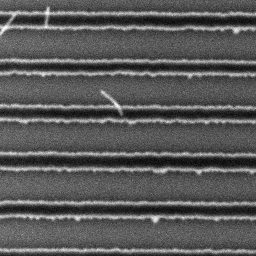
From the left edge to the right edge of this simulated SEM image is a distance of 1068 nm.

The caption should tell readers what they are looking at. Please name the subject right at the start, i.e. lines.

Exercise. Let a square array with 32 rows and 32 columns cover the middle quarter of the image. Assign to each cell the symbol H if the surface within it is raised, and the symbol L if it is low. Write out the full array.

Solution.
HHHHHHHHHHHHHHHHHHHHHHHHHHHHHHHH
HHHHHHHHHHHHHHHHHHHHHHHHHHHHHHHH
HHHHLHHHHHLHHLLLLHHHLHHHHHHHHHHH
LLLLLLLLLLLLLLLLLLLLLLLLLLLLLLLL
LLLLLLLLLLLLLLLLLLLLLLLLLLLLLLLL
LLLLLLLLLLLLLLLLLLLLLLLLLLLLLLLL
LLLLLLLLLLLLLLLLLLLLLLLLLLLLLLLL
LLLLLLLLLLLLLLLLLLLLLLLLLLLLLLLL
LLLLLLLLLLLLLLLLLLLLLLLLLLLLLLLL
LLLLLLLLLLLLLLLLLLLLLLLLLLLLLLLL
LLHHLLHLHHHHHHLHLLLLLHHHLLLLHLLL
HHHHHHHHHHHHHHHHHHHHHHHHHHHHHHHH
HHHHHHHHHHHHHHHHHHHHHHHHHHHHHHHH
HHHHHHHHHHHHHHHHHHHHHHHHHHHHHHHH
LLLLLLLLLHLLLLLLHHLLLLLLLHHLLLLH
LLLLLLLLLLLLLLLLLLLLLLLLLLLLLLLL
LLLLLLLLLLLLLLLLLLLLLLLLLLLLLLLL
LLLLLLLLLLLLLLLLLLLLLLLLLLLLLLLL
LLLLLLLLLLLLLLLLLLLLLLLLLLLLLLLL
LLLLLLLLLLLLLLLLLLLLLLLLLLLLLLLL
LLLLLLLLLLLLLLLLLLLLLLLLLLLLLLLL
LLLLLLLLLLLLLLLLLLLLLLLLLLLLLLLL
HHHHHHHHHHHHHHHHHHHHHHHHHHHHHHHH
HHHHHHHHHHHHHHHHHHHHHHHHHHHHHHHH
HHHHHHHHHHHHHHHHHHHHHHHHHHHHHHHH
HHHHHHHHHHHHHHHHHHHHHHHHHHHHHHHH
LHHLLLLHLHLHHHLLHLLHLLHHHLLHLHHH
LLLLLLLLLLLLLLLLLLLLLLLLLLLLLLLL
LLLLLLLLLLLLLLLLLLLLLLLLLLLLLLLL
LLLLLLLLLLLLLLLLLLLLLLLLLLLLLLLL
LLLLLLLLLLLLLLLLLLLLLLLLLLLLLLLL
LLLLLLLLLLLLLLLLLLLLLLLLLLLLLLLL